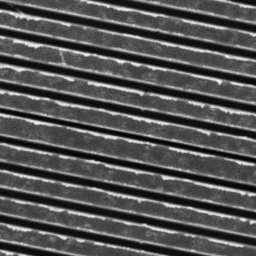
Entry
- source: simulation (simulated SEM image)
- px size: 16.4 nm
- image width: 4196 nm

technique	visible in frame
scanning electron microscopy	parallel lines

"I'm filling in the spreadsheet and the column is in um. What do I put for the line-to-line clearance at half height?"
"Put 0.125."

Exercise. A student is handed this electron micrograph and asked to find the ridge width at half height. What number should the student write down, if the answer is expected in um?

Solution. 0.293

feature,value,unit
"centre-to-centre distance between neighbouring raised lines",0.429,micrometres